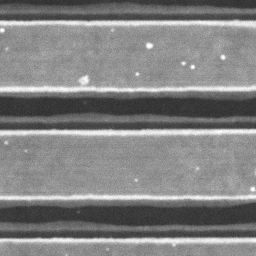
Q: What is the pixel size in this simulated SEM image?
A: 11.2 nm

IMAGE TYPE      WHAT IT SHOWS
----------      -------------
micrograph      lines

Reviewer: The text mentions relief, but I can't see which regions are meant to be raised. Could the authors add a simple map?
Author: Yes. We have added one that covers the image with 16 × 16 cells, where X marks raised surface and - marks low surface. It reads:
----------------
XXXXXXXXXXXXXXXX
XXXXXXXXXXXXXXXX
XXXXXXXXXXXXXXXX
XXXXXXXXXXXXXXXX
XXXXXXXXXXXXXXXX
----------------
----------------
XXXXXXXXXXXXXXXX
XXXXXXXXXXXXXXXX
XXXXXXXXXXXXXXXX
XXXXXXXXXXXXXXXX
-X--X-----------
----------------
----------------
XXXXXXXXXXXXXXXX